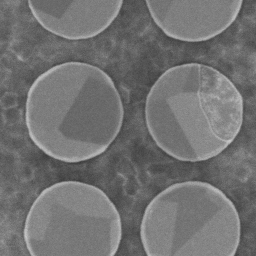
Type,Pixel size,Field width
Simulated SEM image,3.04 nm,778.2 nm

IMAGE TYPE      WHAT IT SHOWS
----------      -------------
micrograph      raised bodies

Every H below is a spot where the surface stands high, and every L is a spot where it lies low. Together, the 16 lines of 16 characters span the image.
LLHHHHHLLHHHHHHL
LLLHHHHLLLHHHHLL
LLLLLLLLLLLHLLLL
LLLLLLLLLLLLLLLL
LLLHHHLLLLHHLLLL
LLHHHHHLLHHHLLLL
LLHHHHHHLHHHHLLL
LLHHHHHHLHHHHLLL
LLHHHHHLLLHHHHLL
LLLHHHLLLLHHHHLL
LLLLLLLLLLLLLLLL
LLLLHLLLLLLLLLLL
LLHHHHHLLLHHHHLL
LLHHHHHLLHHHHHHL
LLHHHHHLLHHHHHHL
LLHHHHHLLHHHHHHL